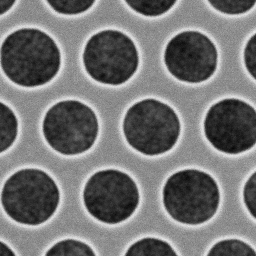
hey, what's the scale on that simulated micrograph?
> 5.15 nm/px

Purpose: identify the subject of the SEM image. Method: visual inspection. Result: holes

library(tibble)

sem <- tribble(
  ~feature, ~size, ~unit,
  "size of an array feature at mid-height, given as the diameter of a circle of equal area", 0.285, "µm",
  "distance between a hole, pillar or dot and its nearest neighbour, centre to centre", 413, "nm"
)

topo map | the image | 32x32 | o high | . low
..oooo......oooo......oooo......
.oooooo...ooooooo....ooooooo...o
oooooooooooooooooooooooooooooooo
oooooooooooooooooooooooooooooooo
o.....oooooo....oooooo....oooooo
.......oooo......oooo......oooo.
.......ooo.......oooo......oooo.
........oo.......oooo......oooo.
.......oooo......oooo......oooo.
o......oooo.....oooooo....oooooo
oo...oooooooo..ooooooooooooooooo
oooooooooooooooooooooooooooooooo
oooooooooooooooooo..oooooooo..oo
.ooooo.....ooooo.....ooooo......
..oooo......oooo......oooo......
..ooo.......ooo.......oooo......
..ooo.......ooo.......oooo......
..oooo......oooo......oooo......
.oooooo....oooooo....oooooo....o
oooooooooooooooooooooooooooooooo
oooooooooooooooooooooooooooooooo
oo....oooooo...ooooooo....oooooo
o......oooo......oooo......oooo.
.......oooo......ooo.......oooo.
........oo.......ooo.......ooo..
.......oooo......oooo......oooo.
o......oooo......oooo......oooo.
oo....oooooo....oooooo....oooooo
oooooooooooooooooooooooooooooooo
oooooooooooooooooooooooooooooooo
.oooooo....oooooo....oooooo....o
..oooo......oooo......oooo......